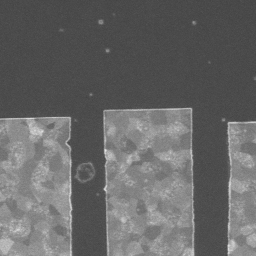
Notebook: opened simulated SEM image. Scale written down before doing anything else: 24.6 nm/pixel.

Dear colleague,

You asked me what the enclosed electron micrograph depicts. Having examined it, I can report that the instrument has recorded one or a few lines or trenches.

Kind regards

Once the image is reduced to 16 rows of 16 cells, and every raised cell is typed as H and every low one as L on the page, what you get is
LLLLLLLLLLLLLLLL
LLLLLLLLLLLLLLLL
LLLLLLLLLLLLLLLL
LLLLLLLLLLLLLLLL
LLLLLLLLLLLLLLLL
LLLLLLLLLLLLLLLL
LLLLLLLLLLLLLLLL
HHHHLLLHHHHHLLLL
HHHHLLLHHHHHLLHH
HHHHLLLHHHHHLLHH
HHHHLLLHHHHHLLHH
HHHHLLLHHHHHLLHH
HHHHLLLHHHHHLLHH
HHHHLLLHHHHHLLHH
HHHHLLLHHHHHLLHH
HHHHLLLHHHHHLLHH